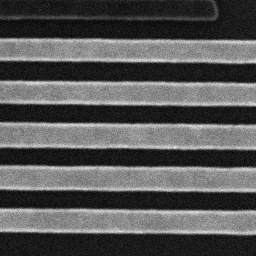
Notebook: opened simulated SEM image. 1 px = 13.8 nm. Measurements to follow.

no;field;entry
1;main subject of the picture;wiring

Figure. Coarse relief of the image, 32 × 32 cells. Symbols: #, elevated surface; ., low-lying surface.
###########################.....
###########################.....
................................
................................
................................
################################
################################
.........#######################
................................
................................
##############################..
################################
################################
................................
................................
######..........................
################################
################################
......................###..#####
................................
................................
################################
################################
################################
................................
................................
################################
################################
################################
................................
................................
................................